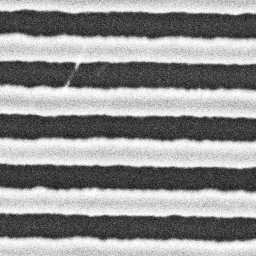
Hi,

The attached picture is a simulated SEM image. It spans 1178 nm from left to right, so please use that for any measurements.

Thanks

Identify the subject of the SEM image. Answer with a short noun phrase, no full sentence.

lines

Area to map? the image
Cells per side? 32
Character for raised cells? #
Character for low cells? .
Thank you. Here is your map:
################################
........##........###..#########
................................
................................
####...##.......................
################################
################################
################################
................................
................................
................................
################################
################################
################################
........................########
................................
................................
##...####..#####.#..............
################################
################################
.###############################
................................
................................
#...##..........................
################################
################################
################################
................................
................................
................................
################################
################################